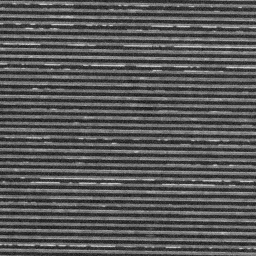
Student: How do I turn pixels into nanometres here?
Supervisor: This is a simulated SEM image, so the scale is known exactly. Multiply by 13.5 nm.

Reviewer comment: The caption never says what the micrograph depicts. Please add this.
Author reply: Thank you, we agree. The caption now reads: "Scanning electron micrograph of parallel lines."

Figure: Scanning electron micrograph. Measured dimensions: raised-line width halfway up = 0.0303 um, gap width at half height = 53.9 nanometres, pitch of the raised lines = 6.7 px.